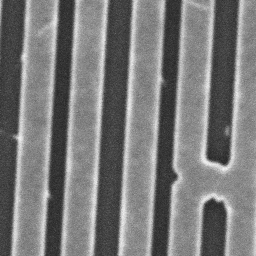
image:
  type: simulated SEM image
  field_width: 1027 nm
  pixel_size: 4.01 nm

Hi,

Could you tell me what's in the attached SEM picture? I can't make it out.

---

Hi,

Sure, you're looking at parallel lines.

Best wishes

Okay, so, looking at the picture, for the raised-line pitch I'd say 209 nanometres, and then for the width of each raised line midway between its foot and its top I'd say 0.121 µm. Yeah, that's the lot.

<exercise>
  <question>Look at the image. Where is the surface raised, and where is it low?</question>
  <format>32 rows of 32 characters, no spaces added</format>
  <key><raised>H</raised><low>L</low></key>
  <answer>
LLLHHHHLLLHHHLLLLHHHLLLHHHHLLLHH
LLLHHHHLLLHHHLLLLHHHLLLHHHHLLLHH
LLLHHHHLLHHHHLLLLHHHLLLHHHHLLLHH
LLLHHHHLLHHHHLLLLHHHLLLHHHLLLLHH
LLLHHHHLLHHHHLLLLHHHLLLHHHLLLLHH
LLLHHHHLLHHHHLLLHHHHLLLHHHLLLLHH
LLLHHHHLLHHHHLLLHHHHLLLHHHLLLLHH
LLLHHHHLLHHHHLLLHHHHLLLHHHLLLLHH
LLLHHHHLLHHHHLLLHHHHLLLHHHLLLLHH
LLLHHHHLLHHHHLLLHHHHLLHHHHLLLLHH
LLLHHHHLLHHHHLLLHHHHLLHHHHLLLLHH
LLLHHHLLLHHHHLLLHHHHLLHHHHLLLHHH
LLLHHHLLLHHHHLLLHHHHLLHHHHLLLHHH
LLLHHHLLLHHHLLLLHHHHLLHHHHLLLHHH
LLLHHHLLLHHHLLLLHHHHLLHHHHLLLHHH
LLLHHHLLLHHHLLLLHHHHLLHHHHLLLHHH
LLHHHHLLLHHHLLLLHHHHLLHHHHLLLHHH
LLHHHHLLLHHHLLLLHHHHLLHHHHLLLHHH
LLHHHHLLLHHHLLLLHHHLLLHHHHLLLHHH
LLHHHHLLHHHHLLLLHHHLLLHHHHLLLHHH
LLHHHHLLHHHHLLLLHHHLLLHHHHHLLHHH
LLHHHHLLHHHHLLLLHHHLLLHHHHHHHHHH
LLHHHHLLHHHHLLLLHHHLLLHHHHHHHHHH
LLHHHHLLHHHHLLLHHHHLLLHHHHHHHHHH
LLHHHHLLHHHHLLLHHHHLLLHHHHHHHHHH
LLHHHHLLHHHHLLLHHHHLLLHHHLLLHHHH
LLHHHHLLHHHHLLLHHHHLLHHHHLLLLHHH
LLHHHHLLHHHHLLLHHHHLLHHHHLLLLHHH
LLHHHHLLHHHHLLLHHHHLLHHHHLLLLHHH
LLHHHLLLHHHHLLLHHHHLLHHHHLLLHHHH
LLHHHLLLHHHHLLLHHHHLLHHHHLLLHHHH
LLHHHLLLHHHLLLLHHHHLLHHHHLLLHHHH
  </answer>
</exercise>